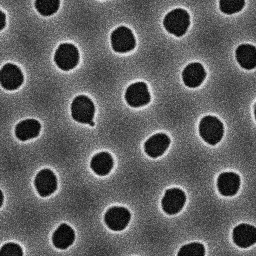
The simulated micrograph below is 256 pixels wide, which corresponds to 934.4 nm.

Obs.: a regular array of holes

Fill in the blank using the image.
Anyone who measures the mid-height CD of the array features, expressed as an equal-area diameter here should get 0.0964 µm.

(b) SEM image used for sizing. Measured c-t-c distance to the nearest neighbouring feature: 56 pixels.